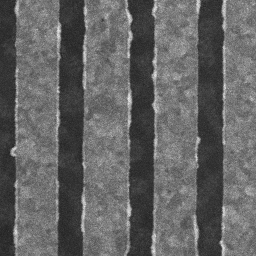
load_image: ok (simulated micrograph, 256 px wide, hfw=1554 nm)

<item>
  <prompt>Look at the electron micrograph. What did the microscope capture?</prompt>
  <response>one or a few lines or trenches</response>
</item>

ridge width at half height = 251 nanometres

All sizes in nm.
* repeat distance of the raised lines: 419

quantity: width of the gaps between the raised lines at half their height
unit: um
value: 0.15